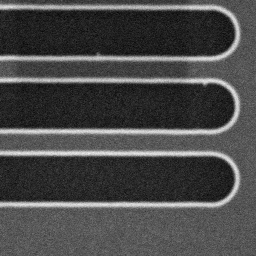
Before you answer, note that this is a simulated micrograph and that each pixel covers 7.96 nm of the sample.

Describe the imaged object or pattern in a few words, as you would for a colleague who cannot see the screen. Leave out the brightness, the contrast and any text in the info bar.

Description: groups of lines, slits or small figures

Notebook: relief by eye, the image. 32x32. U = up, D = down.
UUUUUUUUUUUUUUUUUUUUUUUUUUUUUUUU
DDDDDDDDDDDDDDDDDDDDDDDDDDDDUUUU
DDDDDDDDDDDDDDDDDDDDDDDDDDDDDUUU
DDDDDDDDDDDDDDDDDDDDDDDDDDDDDDUU
DDDDDDDDDDDDDDDDDDDDDDDDDDDDDDUU
DDDDDDDDDDDDDDDDDDDDDDDDDDDDDUUU
DDDDDDDDDDDDDDDDDDDDDDDDDDDDDUUU
UUUUUUUUUUUUUUUUUUUUUUUUUUUUUUUU
UUUUUUUUUUUUUUUUUUUUUUUUUUUUUUUU
UUUUUUUUUUUUUUUUUUUUUUUUUUUUUUUU
DDDDDDDDDDDDDDDDDDDDDDDDDDDDUUUU
DDDDDDDDDDDDDDDDDDDDDDDDDDDDDUUU
DDDDDDDDDDDDDDDDDDDDDDDDDDDDDDUU
DDDDDDDDDDDDDDDDDDDDDDDDDDDDDDUU
DDDDDDDDDDDDDDDDDDDDDDDDDDDDDUUU
DDDDDDDDDDDDDDDDDDDDDDDDDDDDDUUU
UUUUUUUUUUUUUUUUUUUUUDDDUUUUUUUU
UUUUUUUUUUUUUUUUUUUUUUUUUUUUUUUU
UUUUUUUUUUUUUUUUUUUUUUUUUUUUUUUU
DDDDDDDDDDDDDDDDDDDDDDDDDDDDUUUU
DDDDDDDDDDDDDDDDDDDDDDDDDDDDDUUU
DDDDDDDDDDDDDDDDDDDDDDDDDDDDDDUU
DDDDDDDDDDDDDDDDDDDDDDDDDDDDDDUU
DDDDDDDDDDDDDDDDDDDDDDDDDDDDDUUU
DDDDDDDDDDDDDDDDDDDDDDDDDDDDDUUU
DDDDDDDDDDDDDDDDDDDDDDDDDDDUUUUU
UUUUUUUUUUUUUUUUUUUUUUUUUUUUUUUU
UUUUUUUUUUUUUUUUUUUUUUUUUUUUUUUU
UUUUUUUUUUUUUUUUUUUUUUUUUUUUUUUU
UUUUUUUUUUUUUUUUUUUUUUUUUUUUUUUU
UUUUUUUUUUUUUUUUUUUUUUUUUUUUUUUU
UUUUUUUUUUUUUUUUUUUUUUUUUUUUUUUU